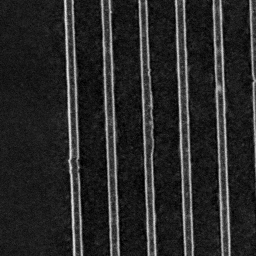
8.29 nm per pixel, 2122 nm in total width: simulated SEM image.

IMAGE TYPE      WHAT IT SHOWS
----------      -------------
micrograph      parallel lines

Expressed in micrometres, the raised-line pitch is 0.306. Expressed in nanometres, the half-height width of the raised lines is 64.2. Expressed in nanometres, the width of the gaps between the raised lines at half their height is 241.